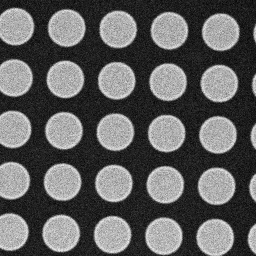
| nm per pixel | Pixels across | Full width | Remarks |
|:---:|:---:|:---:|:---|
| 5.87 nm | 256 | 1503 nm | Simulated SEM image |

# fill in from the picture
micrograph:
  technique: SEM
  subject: an array of small figures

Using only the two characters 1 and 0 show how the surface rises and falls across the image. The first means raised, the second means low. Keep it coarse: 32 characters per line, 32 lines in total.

00000000000000000000000000000000
01100001110000100000000000000000
11110011110001111001111000111000
11110011111001111001111001111100
11110011110001111001111001111100
01100001100001110000111000111000
00000000000000000000000000000000
01000000000000000000000000000000
11110011110001110000110000111000
11110011110011111001111001111000
11110011110011111001111001111100
11100001110001110001111001111100
00000000000000000000110000110000
00000000000000000000000000000000
11100001100001100000110000000000
11110011110011110001111001111000
11110011110011111001111001111101
11100011110011110001111001111001
00000001100001110001110000111000
00000000000000000000000000000000
11000000000000000000000000000000
11100011110011110001110000111000
11110011110011110011111001111001
11110011110011110011111001111001
11100011100001110001111001111001
00000000000000000000000000110000
00000000000000000000000000000000
11100011100001100001110000100000
11110111110011110011111001111000
11100111110011110011111001111001
11100011110011110011111001111001
00000000000001100001110001110000